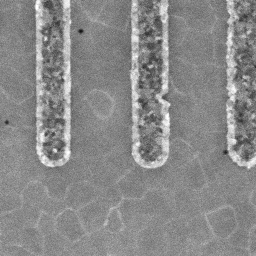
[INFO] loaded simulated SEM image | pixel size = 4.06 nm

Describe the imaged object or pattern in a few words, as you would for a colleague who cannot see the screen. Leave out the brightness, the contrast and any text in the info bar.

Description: one or a few lines or trenches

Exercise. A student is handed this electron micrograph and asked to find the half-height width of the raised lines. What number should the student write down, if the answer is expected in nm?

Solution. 118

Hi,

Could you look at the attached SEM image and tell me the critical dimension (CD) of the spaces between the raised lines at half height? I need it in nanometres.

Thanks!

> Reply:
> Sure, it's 271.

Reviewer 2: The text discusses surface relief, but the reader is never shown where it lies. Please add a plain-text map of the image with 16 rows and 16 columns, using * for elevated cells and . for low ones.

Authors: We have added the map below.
..**....**....**
..**....**....**
..**....**....**
..**....**....**
..**....**....**
..**....**....**
..**....**....**
..**....**....**
..**....**....**
..**....**....**
................
................
................
................
................
................